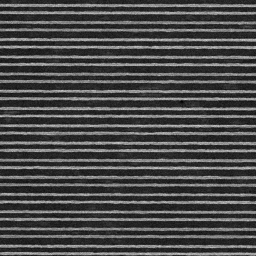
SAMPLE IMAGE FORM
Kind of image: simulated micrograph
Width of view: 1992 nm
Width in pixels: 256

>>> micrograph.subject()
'parallel lines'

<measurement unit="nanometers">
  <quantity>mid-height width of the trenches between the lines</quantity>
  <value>45.7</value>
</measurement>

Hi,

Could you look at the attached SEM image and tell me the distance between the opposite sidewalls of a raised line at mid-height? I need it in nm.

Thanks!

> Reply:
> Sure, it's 16.5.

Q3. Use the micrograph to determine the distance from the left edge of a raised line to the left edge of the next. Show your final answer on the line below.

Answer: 8.56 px